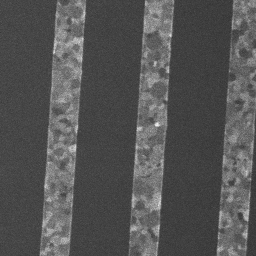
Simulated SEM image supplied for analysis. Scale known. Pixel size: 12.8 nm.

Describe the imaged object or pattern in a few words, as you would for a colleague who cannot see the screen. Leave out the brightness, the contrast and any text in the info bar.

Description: one or a few lines or trenches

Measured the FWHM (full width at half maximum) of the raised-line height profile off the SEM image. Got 363 nanometers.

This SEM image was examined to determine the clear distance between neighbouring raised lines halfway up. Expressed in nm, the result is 770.